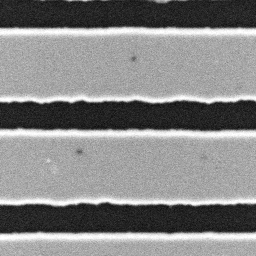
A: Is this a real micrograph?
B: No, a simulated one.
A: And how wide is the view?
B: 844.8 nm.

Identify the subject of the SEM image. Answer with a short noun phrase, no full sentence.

lines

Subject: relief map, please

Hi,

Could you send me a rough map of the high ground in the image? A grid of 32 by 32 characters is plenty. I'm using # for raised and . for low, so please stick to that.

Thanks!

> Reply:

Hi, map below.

................................
................................
................................
................................
################################
################################
################################
################################
################################
################################
################################
################################
######################.#######..
................................
................................
................................
########################....####
################################
################################
################################
################################
################################
################################
################################
################################
###..####......#######.######...
................................
................................
................................
################################
################################
################################